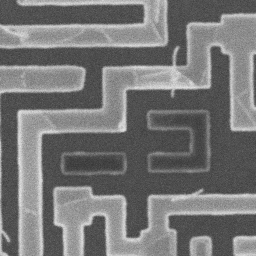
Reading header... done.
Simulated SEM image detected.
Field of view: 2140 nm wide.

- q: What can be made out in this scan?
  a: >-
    wiring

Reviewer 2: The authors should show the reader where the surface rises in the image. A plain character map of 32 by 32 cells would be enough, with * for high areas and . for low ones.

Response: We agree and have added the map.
..................***...........
..................***...........
..................***.......****
*********************...********
*********************...********
********************....********
........................**..****
........................**...**.
**********.....***********...**.
**********...*************...**.
**********...*************...**.
.............***.............**.
.............***.............***
.............***.............***
..**************...*******...***
..**************...*******...***
..****..................**......
..***...................**......
..***...................**......
..***...*******....*******......
..***...********...*******......
...**...*******.................
...**...........................
...**...........................
...**..*****...........**.**..**
...**..*********...*************
...**..*********...**********...
...**..****..***...**...........
...**...**...**....**...........
...**...**...***..****..........
...**...**....********..**...***
...**...**....********..**...***